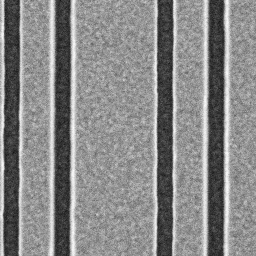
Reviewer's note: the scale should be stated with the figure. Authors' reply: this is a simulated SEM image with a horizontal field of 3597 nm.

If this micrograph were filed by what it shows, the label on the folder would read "lines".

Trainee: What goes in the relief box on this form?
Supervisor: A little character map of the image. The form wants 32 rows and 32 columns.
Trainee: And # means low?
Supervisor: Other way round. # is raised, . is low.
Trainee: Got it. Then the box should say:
...####..###########..####..####
...####..###########..####..####
...####..###########..####..####
...####..###########..####..####
...####..###########..####..####
...####..###########..####..####
...####..###########..####..####
...####..###########..####..####
...####..###########..####..####
...####..###########..####..####
...###...###########..####..####
...###...###########..####..####
...###...###########..####..####
...####..###########..####..####
..#####..###########..####..####
...###...###########..####..####
...###...###########..####..####
...###...###########..####..####
..####...###########..####..####
..####...###########..####..####
..####...###########..####..####
..####...##########...####..####
...###...###########..####..####
..####...###########..####..####
..####...###########..####..####
..####...###########..####..####
..####...###########..####..####
..####...###########..####..####
..####...###########..####..####
..####...###########..####..####
..####...##########...####..####
..####...##########...####..####